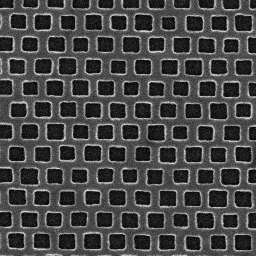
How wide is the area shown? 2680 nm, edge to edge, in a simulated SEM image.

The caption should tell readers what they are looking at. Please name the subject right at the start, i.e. a regular array of holes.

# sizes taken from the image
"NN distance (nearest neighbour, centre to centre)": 256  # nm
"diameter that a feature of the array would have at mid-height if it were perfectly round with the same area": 181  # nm